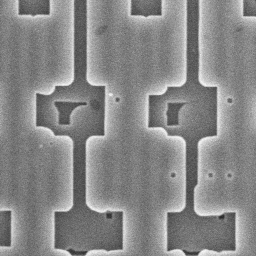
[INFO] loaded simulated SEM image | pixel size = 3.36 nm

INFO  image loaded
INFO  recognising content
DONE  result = wiring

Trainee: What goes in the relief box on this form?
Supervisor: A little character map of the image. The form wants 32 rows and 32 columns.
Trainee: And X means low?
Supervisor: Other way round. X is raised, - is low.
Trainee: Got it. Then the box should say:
XX----XXX--XXXXX----XXX--XXXXX--
XX----XXX--XXXXX----XXX--XXXXX--
XXXXXXXXX--XXXXXXXXXXXX--XXXXXXX
XXXXXXXXX--XXXXXXXXXXXX--XXXXXXX
XXXXXXXXX--XXXXXXXXXXXX--XXXXXXX
XXXXXXXXX--XXXXXXXXXXXX--XXXXXXX
XXXXXXXXX--XXXXXXXXXXXX--XXXXXXX
XXXXXXXXX--XXXXXXXXXXXX--XXXXXXX
XXXXXXXXX--XXXXXXXXXXXX--XXXXXXX
XXXXXXXXX--XXXXXXXXXXXX--XXXXXXX
XXXXXXXXX--XXXXXXXXXXXX--XXXXXXX
XXXXXX-------XXXXXXXX------XXXXX
XXXX---------XXXXXX--------XXXXX
XXXX---------XXXXXX--------XXXXX
XXXX---------XXXXXX--------XXXXX
XXXXX--------XXXXXX--------XXXXX
XXXXXXX------XXXXXXXX------XXXXX
XXXXXXXXX--XXXXXXXXXXXX--XXXXXXX
XXXXXXXXX--XXXXXXXXXXXX--XXXXXXX
XXXXXXXXX--XXXXXXXXXXXX--XXXXXXX
XXXXXXXXX--XXXXXXXXXXXX--XXXXXXX
XXXXXXXXX--XXXXXXXXXXXX--XXXXXXX
XXXXXXXXX--XXXXXXXXXXXX--XXXXXXX
XXXXXXXXX--XXXXXXXXXXXX-XXXXXXXX
XXXXXXXXX--XXXXXXXXXXXX-XXXXXXXX
XXXXXXXXX--XXXXXXXXXXXX-XXXXXXXX
-XXXXXX--------XXXXXX----XXX-XXX
-XXXXXX--------XXXXXX---------XX
-XXXXXX--------XXXXXX---------XX
-XXXXXX--------XXXXXX---------XX
-XXXXXX--------XXXXXX---------XX
XXXXXXXX---XXXXXXXXXXXX--XX-XXXX